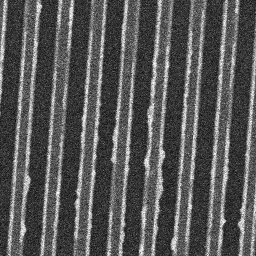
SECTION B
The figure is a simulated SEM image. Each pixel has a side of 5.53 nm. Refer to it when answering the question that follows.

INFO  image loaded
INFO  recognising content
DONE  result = parallel lines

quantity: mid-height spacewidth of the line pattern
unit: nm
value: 101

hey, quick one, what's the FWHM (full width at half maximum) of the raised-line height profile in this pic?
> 81.3 nanometers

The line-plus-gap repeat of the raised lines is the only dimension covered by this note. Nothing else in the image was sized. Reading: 182 nm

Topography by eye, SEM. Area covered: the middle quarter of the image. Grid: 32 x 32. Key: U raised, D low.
UDDDDDUUUDDDDDUUUUDDDDUUUUDDDDDU
UDDDDDUUUDDDDDUUUUDDDDUUUUDDDDDU
UDDDDDUUUDDDDDUUUUDDDDUUUUDDDDDU
UDDDDDUUUDDDDDUUUDDDDDUUUUDDDDDU
UDDDDUUUUDDDDDUUUDDDDDUUUUDDDDDU
UDDDDUUUUDDDDDUUUDDDDDUUUUDDDDUU
DDDDDUUUUDDDDDUUUDDDDDUUUDDDDDUU
DDDDDUUUUDDDDDUUUDDDDDUUUDDDDDUU
DDDDDUUUUDDDDDUUUDDDDDUUUDDDDDUU
DDDDDUUUUDDDDDUUUDDDDDUUUDDDDDUU
DDDDDUUUUDDDDUUUUDDDDUUUUDDDDDUU
DDDDDUUUUDDDDUUUUDDDDUUUUDDDDDUU
DDDDDUUUUDDDDUUUUDDDDUUUUDDDDDUU
DDDDDUUUUDDDDUUUUDDDDUUUUDDDDDUU
DDDDDUUUUDDDDUUUUDDDDUUUUDDDDDUU
DDDDUUUUUDDDDUUUUDDDDUUUUDDDDDUU
DDDDDUUUDDDDDUUUDDDDDUUUUDDDDDUU
DDDDUUUUDDDDUUUUDDDDDUUUUDDDDUUU
DDDDUUUUUDDDUUUUUDDDDUUUUDDDDDUU
DDDDUUUUDDDDUUUUDDDDDUUUUDDDDDUU
DDDDUUUUDDDDUUUUDDDDDUUUDDDDDUUU
DDDDUUUUDDDDUUUUUDDDDUUUUDDDDUUU
DDDDUUUUDDDDUUUUDDDDDUUUUDDDDUUU
DDDDUUUUDDDDUUUUDDDDUUUUUDDDDUUU
DDDDUUUUDDDDUUUUDDDDUUUUUDDDDUUU
DDDDUUUUDDDDUUUUDDDDUUUUDDDDDUUU
DDDDUUUUDDDDUUUUDDDDDUUUDDDDDUUU
DDDDUUUUDDDDUUUUDDDDUUUUDDDDDUUU
DDDDUUUUDDDDUUUUDDDDUUUUUDDDDUUU
DDDDUUUUDDDDUUUUDDDDDUUUUDDDDUUU
DDDDUUUDDDDDUUUDDDDDUUUUUDDDDUUU
DDDUUUUDDDDDUUUDDDDDUUUUUDDDDUUU